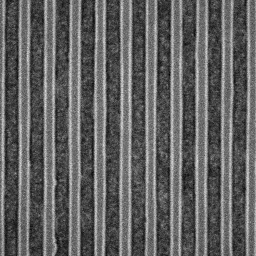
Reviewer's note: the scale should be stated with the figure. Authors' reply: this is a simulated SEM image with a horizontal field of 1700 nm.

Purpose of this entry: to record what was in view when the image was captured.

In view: parallel lines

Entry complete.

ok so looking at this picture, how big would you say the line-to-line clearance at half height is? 102 nanometres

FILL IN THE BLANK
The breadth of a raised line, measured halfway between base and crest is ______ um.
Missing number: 0.0664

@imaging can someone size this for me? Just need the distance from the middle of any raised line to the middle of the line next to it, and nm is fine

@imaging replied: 168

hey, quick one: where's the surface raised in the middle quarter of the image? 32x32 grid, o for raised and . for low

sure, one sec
..oo....oo....ooo....oo....oo...
..oo....oo....ooo....oo....oo...
.ooo....oo....ooo....oo....oo...
.ooo....oo....oo.....oo....oo...
.ooo....oo....oo.....oo....oo...
..oo....oo....oo.....oo....oo...
..oo....oo....oo.....oo....oo...
..oo....oo....oo.....oo....oo...
..oo....oo....oo.....oo....oo...
..oo....oo....ooo....oo....oo...
..oo....oo....ooo....oo....oo...
..oo....oo....ooo....oo....oo...
..oo....oo....ooo....oo....oo...
..oo....oo....ooo....oo....oo...
..oo....oo....ooo....oo....oo...
..oo....oo....ooo....oo....oo...
..oo....oo....ooo....oo....oo...
..oo....oo....ooo....oo....oo...
..oo....oo....ooo....oo....oo...
..oo....oo....ooo....oo....oo...
..oo....oo....ooo....oo....oo...
..oo....oo....ooo....oo....oo...
.ooo....oo....ooo....oo....oo...
.ooo....oo....oo.....oo....oo...
.ooo....oo....ooo....oo....oo...
.ooo....oo....ooo....oo....oo...
.ooo....oo....ooo....oo....oo...
.ooo....oo....ooo....oo....oo...
.ooo....oo....ooo....oo....oo...
.ooo....oo....ooo....oo....oo...
.ooo....oo....ooo....oo....oo...
.ooo....oo....ooo....oo....oo...